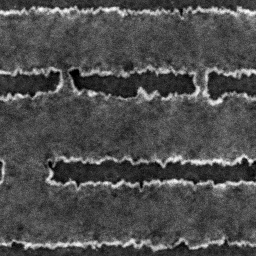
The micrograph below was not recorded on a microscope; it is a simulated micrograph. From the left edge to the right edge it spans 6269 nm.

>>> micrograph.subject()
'one or a few lines or trenches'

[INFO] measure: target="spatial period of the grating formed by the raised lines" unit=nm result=2110